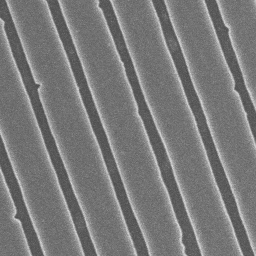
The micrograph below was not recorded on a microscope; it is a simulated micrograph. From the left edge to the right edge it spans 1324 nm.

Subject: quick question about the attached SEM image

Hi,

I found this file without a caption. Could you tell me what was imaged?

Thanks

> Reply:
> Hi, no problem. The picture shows parallel lines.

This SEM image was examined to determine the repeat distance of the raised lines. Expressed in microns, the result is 0.257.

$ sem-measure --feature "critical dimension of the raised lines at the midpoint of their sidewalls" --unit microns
0.194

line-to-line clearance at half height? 61.4 nm